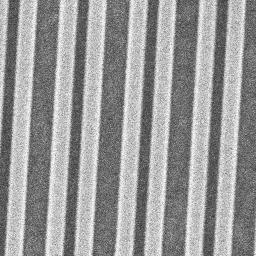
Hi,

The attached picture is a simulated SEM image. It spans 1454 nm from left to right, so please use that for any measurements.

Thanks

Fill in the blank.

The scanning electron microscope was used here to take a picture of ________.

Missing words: parallel lines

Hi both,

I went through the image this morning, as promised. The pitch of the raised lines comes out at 197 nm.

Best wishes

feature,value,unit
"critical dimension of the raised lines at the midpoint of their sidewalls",90.8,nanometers